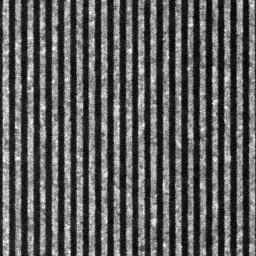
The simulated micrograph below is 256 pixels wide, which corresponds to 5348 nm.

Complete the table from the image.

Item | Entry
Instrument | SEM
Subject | parallel lines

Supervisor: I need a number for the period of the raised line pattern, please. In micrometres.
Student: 0.257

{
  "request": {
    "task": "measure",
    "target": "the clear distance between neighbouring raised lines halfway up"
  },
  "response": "146 nm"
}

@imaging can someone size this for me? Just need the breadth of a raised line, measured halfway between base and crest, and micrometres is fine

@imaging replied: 0.112